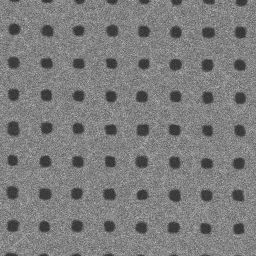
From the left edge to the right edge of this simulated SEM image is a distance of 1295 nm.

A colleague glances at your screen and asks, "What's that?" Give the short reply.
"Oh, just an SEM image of a regular array of holes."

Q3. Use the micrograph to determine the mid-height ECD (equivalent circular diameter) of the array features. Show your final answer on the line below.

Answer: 58.8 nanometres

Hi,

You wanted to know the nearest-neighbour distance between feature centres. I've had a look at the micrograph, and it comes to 161 nanometers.